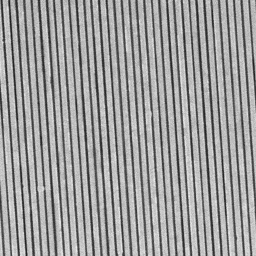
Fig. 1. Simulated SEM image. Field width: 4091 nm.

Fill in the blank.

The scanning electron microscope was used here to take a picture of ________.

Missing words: parallel lines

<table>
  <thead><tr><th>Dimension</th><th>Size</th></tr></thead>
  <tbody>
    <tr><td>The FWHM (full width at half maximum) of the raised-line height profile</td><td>81.7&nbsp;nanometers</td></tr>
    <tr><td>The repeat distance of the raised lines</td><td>120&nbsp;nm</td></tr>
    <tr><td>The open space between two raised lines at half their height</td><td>0.0418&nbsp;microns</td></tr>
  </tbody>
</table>